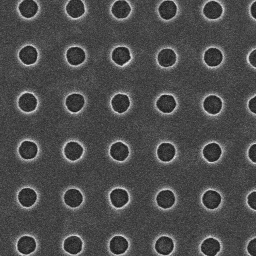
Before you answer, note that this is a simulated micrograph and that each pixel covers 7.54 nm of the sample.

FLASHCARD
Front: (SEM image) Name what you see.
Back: a regular array of holes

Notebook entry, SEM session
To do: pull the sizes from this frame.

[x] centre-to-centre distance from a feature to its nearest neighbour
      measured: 45.7 pixels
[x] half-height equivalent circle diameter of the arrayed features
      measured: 0.142 um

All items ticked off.